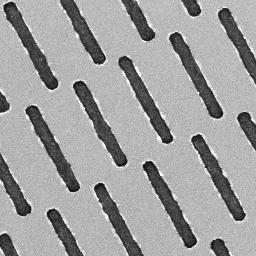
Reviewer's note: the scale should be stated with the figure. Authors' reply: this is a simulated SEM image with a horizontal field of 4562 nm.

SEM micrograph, holes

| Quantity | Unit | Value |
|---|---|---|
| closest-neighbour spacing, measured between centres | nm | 985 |